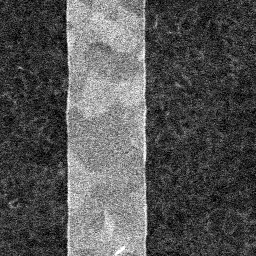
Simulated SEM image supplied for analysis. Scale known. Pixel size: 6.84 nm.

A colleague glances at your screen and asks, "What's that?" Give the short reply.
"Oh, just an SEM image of one or a few lines or trenches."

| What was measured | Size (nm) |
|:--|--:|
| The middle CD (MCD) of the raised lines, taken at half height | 528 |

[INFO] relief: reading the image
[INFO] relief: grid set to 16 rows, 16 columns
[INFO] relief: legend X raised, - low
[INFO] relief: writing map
----XXXXX-------
----XXXXX-------
----XXXXX-------
----XXXXX-------
----XXXXX-------
----XXXXX-------
----XXXXX-------
----XXXXX-------
----XXXXX-------
----XXXXX-------
----XXXXX-------
----XXXXX-------
----XXXXX-------
----XXXXX-------
----XXXXX-------
----XXXXX-------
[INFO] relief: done